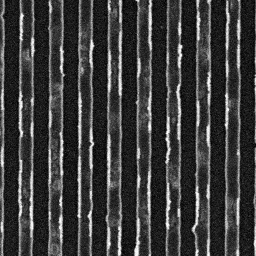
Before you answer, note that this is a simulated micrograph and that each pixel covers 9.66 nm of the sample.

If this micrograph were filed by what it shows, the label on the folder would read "parallel lines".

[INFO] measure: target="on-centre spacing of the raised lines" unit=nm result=285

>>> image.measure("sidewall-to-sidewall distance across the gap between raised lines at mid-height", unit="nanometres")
157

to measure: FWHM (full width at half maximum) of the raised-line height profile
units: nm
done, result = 129